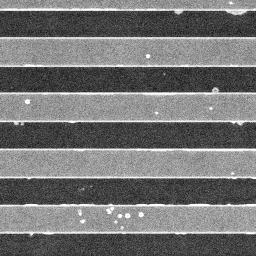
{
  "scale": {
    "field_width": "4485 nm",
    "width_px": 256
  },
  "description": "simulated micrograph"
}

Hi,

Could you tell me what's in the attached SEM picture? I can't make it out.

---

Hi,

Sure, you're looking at lines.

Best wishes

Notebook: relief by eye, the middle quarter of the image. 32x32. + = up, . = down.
++++++++++++++++++++++++++++++++
................................
................................
................................
................................
................................
................................
++++++++++++++++++++++++++++++++
++++++++++++++++++++++++++++++++
++++++++++++++++++++++++++++++++
++++++++++++++++++++++++++++++++
++++++++++++++++++++++++++++++++
++++++++++++++++++++++++++++++++
++++++++++++++++++++++++++++++++
.++.............................
................................
................................
................................
................................
................................
................................
++++++++++++++++++++++++++++++++
++++++++++++++++++++++++++++++++
++++++++++++++++++++++++++++++++
++++++++++++++++++++++++++++++++
++++++++++++++++++++++++++++++++
++++++++++++++++++++++++++++++++
++++++++++++++++++++++++++++++++
................................
................................
................................
................................